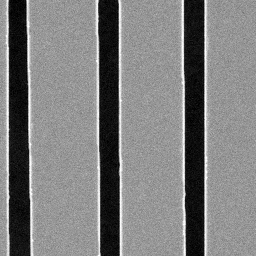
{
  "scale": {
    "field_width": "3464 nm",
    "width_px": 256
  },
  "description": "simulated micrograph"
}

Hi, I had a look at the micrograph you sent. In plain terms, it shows lines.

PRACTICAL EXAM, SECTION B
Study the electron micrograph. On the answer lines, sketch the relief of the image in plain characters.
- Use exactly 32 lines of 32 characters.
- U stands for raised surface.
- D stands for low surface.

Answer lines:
UDDUUUUUUUUUDDDUUUUUUUUDDDUUUUUU
UDDUUUUUUUUUDDDUUUUUUUUDDDUUUUUU
UDDUUUUUUUUUDDDUUUUUUUUDDDUUUUUU
UDDUUUUUUUUUDDDUUUUUUUUDDDUUUUUU
UDDDUUUUUUUUDDDUUUUUUUUDDDUUUUUU
UDDDUUUUUUUUDDDUUUUUUUUDDDUUUUUU
UDDDUUUUUUUUDDDUUUUUUUUDDDUUUUUU
UDDDUUUUUUUUDDDUUUUUUUUDDDUUUUUU
UDDDUUUUUUUUDDDUUUUUUUUDDDUUUUUU
UDDDUUUUUUUUDDDUUUUUUUUDDDUUUUUU
UDDDUUUUUUUUDDDUUUUUUUUDDDUUUUUU
UDDDUUUUUUUUDDDUUUUUUUUDDDUUUUUU
UDDDUUUUUUUUDDDUUUUUUUUDDDUUUUUU
UDDDUUUUUUUUDDDUUUUUUUUDDDUUUUUU
UDDDUUUUUUUUDDDUUUUUUUUDDDUUUUUU
UDDDUUUUUUUUDDDUUUUUUUUDDDUUUUUU
UDDDUUUUUUUUDDDUUUUUUUUDDDUUUUUU
UDDDUUUUUUUUDDDUUUUUUUUDDDUUUUUU
UDDDUUUUUUUUDDDUUUUUUUUDDDUUUUUU
UDDDUUUUUUUUDDDUUUUUUUUDDDUUUUUU
UDDDUUUUUUUUDDDUUUUUUUUDDDUUUUUU
UDDDUUUUUUUUDDDUUUUUUUUDDDUUUUUU
UDDDUUUUUUUUDDDUUUUUUUUDDDUUUUUU
UDDDUUUUUUUUDDDUUUUUUUUDDDUUUUUU
UDDDUUUUUUUUDDDUUUUUUUUDDDUUUUUU
UDDDUUUUUUUUDDDUUUUUUUUDDDUUUUUU
UDDDUUUUUUUUDDDUUUUUUUUDDDUUUUUU
UDDDUUUUUUUUDDDUUUUUUUUDDDUUUUUU
UDDDUUUUUUUUDDDUUUUUUUUDDDUUUUUU
UDDDUUUUUUUUDDDUUUUUUUUDDDUUUUUU
UDDDUUUUUUUUDDDUUUUUUUUDDDUUUUUU
UDDDUUUUUUUUDDDUUUUUUUUDDDUUUUUU